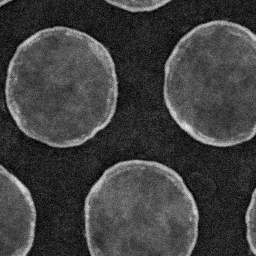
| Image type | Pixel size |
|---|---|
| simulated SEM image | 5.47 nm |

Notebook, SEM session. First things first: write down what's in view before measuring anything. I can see raised bodies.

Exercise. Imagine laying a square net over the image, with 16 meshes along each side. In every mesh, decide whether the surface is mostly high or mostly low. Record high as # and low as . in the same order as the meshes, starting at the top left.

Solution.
........#.......
.............##.
..####.....#####
.######....#####
.######...######
#######...######
.######....#####
.######....#####
..####......####
................
.......###......
#.....#####.....
##...#######....
##...#######...#
##...#######...#
##....######....